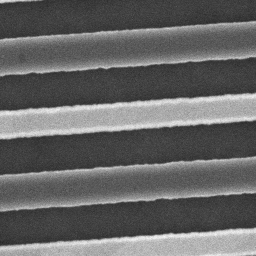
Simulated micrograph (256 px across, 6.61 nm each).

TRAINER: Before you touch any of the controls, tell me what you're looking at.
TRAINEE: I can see lines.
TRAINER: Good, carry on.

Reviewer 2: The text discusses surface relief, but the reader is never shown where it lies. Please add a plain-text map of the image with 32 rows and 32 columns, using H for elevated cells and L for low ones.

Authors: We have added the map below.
LLLLLLLLLLLLLLLLLLLLLLLLLLLLLLLL
LLLLLLLLLLLLLLLLLLLLLLLLLLLLLLLL
LLLLLLLLLLLLLLLLLLLLLLLLLLLLLLLL
LLLLLLLLLLLLLLLLLLLLLHHHHHHHHHHH
LLLLLLHHHHHHHHHHHHHHHHHHHHHHHHHH
HHHHHHHHHHHHHHHHHHHHHHHHHHHHHHHH
HHHHHHHHHHHHHHHHHHHHHHHHHHHHHHHH
HHHHHHHHHHHHHHHHHHHHHHHHHHLLLLLL
HHHHHHHHHHHHLHLLLLLLLLLLLLLLLLLL
LLLLLLLLLLLLLLLLLLLLLLLLLLLLLLLL
LLLLLLLLLLLLLLLLLLLLLLLLLLLLLLLL
LLLLLLLLLLLLLLLLLLLLLLLLLLLLLLLL
LLLLLLLLLLLLLLLLLLLLHHHHHHHHHHHH
LLLLLLLHHHHHHHHHHHHHHHHHHHHHHHHH
HHHHHHHHHHHHHHHHHHHHHHHHHHHHHHHH
HHHHHHHHHHHHHHHHHHHHHHHHHLLLLLLL
HHHHHHHHHHHLLLLLLLLLLLLLLLLLLLLL
LLLLLLLLLLLLLLLLLLLLLLLLLLLLLLLL
LLLLLLLLLLLLLLLLLLLLLLLLLLLLLLLL
LLLLLLLLLLLLLLLLLLLLLLLLLLLLLLLL
LLLLLLLLLLLLLLLLLLLLHHHHHHHHHHHH
LLLLLLHHHHHHHHHHHHHHHHHHHHHHHHHH
HHHHHHHHHHHHHHHHHHHHHHHHHHHHHHHH
HHHHHHHHHHHHHHHHHHHHHHHHHHHHHHHH
HHHHHHHHHHHHHHHHHHHHHHHHHHLLLLLL
HHHHHHHHHHHHLLLLLLLLLLLLLLLLLLLL
LLLLLLLLLLLLLLLLLLLLLLLLLLLLLLLL
LLLLLLLLLLLLLLLLLLLLLLLLLLLLLLLL
LLLLLLLLLLLLLLLLLLLLLLLLLLLLLLLL
LLLLLLLLLLLLLLLLLLLHHHHHHHHHHHHH
LLLLLLHHHHHHHHHHHHHHHHHHHHHHHHHH
HHHHHHHHHHHHHHHHHHHHHHHHHHHHHHHH